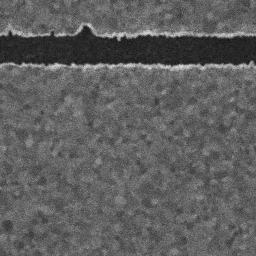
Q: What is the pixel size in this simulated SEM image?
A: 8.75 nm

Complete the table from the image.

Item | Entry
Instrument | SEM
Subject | one or a few lines or trenches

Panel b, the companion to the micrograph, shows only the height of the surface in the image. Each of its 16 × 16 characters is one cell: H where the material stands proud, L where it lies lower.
HHHHHHHHHHHHHHHH
HHHHHHHHHHHHHHHH
LLLLLLLLLLLLLLLL
LLLLLLLLLLLLLLLL
HHHHHHHHHHHHHHHH
HHHHHHHHHHHHHHHH
HHHHHHHHHHHHHHHH
HHHHHHHHHHHHHHHH
HHHHHHHHHHHHHHHH
HHHHHHHHHHHHHHHH
HHHHHHHHHHHHHHHH
HHHHHHHHHHHHHHHH
HHHHHHHHHHHHHHHH
HHHHHHHHHHHHHHHH
HHHHHHHHHHHHHHHH
HHHHHHHHHHHHHHHH